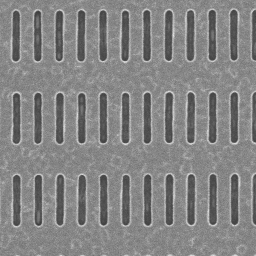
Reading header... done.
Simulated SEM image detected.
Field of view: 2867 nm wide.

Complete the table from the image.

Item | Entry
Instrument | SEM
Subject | a regular array of holes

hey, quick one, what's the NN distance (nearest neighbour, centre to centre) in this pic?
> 241 nanometres